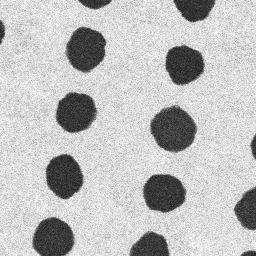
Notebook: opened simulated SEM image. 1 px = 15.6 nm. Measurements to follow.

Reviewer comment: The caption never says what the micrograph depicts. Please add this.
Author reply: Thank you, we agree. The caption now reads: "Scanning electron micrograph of holes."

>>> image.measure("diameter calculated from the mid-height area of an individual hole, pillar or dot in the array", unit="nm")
629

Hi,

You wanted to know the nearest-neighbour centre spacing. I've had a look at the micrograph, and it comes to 1000 nm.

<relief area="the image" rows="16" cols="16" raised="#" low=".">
###########..###
################
####...#########
####...###...###
##########...###
################
####..##########
####..####..####
##########..####
################
###..###########
###..####..#####
#########..####.
###############.
##..############
##..####..######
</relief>